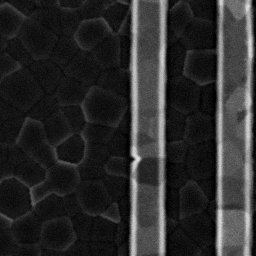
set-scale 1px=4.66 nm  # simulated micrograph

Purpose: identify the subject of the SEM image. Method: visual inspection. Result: one or a few lines or trenches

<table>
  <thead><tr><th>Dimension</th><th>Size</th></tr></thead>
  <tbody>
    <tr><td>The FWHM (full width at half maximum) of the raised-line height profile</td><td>129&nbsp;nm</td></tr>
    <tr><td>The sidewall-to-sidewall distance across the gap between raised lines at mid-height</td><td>58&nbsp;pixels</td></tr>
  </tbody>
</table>